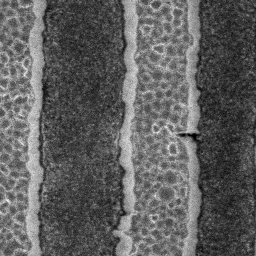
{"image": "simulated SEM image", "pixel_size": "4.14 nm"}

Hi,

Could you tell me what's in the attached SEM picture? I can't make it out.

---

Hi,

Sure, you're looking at one or a few lines or trenches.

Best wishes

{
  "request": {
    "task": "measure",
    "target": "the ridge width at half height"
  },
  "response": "276 nm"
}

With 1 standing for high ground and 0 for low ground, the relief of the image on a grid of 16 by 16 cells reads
1110000011110000
1100000011110000
1100000011110000
1100000011110000
1100000011110000
1100000011110000
1100000011110000
1100000011110000
1100000011110000
1100000011110000
1100000011110000
1100000011110000
1100000011110000
1100000011110000
1100000011110000
1100000011110000